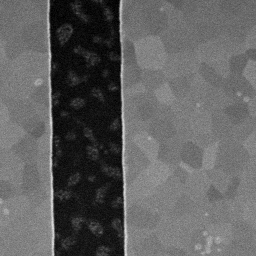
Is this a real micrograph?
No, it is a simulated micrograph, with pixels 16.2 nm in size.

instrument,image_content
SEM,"one or a few lines or trenches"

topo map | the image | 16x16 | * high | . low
***.....********
***.....********
***.....********
***.....********
***.....********
***.....********
***.....********
***.....********
***.....********
***.....********
***.....********
***.....********
***.....********
***.....********
***.....********
***.....********